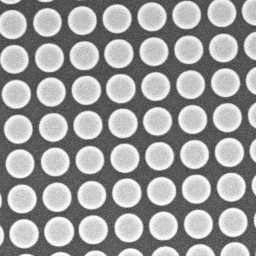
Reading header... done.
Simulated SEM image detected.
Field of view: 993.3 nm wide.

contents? an array of small figures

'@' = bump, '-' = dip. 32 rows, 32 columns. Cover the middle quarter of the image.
---@@@@@----@@@-----------------
--------------------------------
---------------------@@@@----@@@
----@@@@----@@@@@---@@@@@@---@@@
---@@@@@@--@@@@@@@-@@@@@@@--@@@@
--@@@@@@@--@@@@@@@-@@@@@@@--@@@@
--@@@@@@@--@@@@@@@-@@@@@@@--@@@@
--@@@@@@@--@@@@@@@--@@@@@@---@@@
---@@@@@@--@@@@@@----@@@@-----@@
---@@@@@-----@@@----------------
-------------------------------@
-------------@@@-----@@@@@----@@
----@@@@----@@@@@@--@@@@@@---@@@
---@@@@@@--@@@@@@@--@@@@@@@--@@@
@-@@@@@@@--@@@@@@@--@@@@@@@--@@@
@-@@@@@@@--@@@@@@@--@@@@@@@--@@@
@--@@@@@@--@@@@@@@---@@@@@----@@
@--@@@@@@---@@@@@-----@@@-------
----@@@-------------------------
-------------------------------@
-------------@@@@----@@@@@----@@
----@@@@@---@@@@@@---@@@@@@--@@@
@--@@@@@@@--@@@@@@@-@@@@@@@--@@@
@--@@@@@@@--@@@@@@@-@@@@@@@--@@@
@--@@@@@@@--@@@@@@@--@@@@@@---@@
@--@@@@@@@--@@@@@@---@@@@@-----@
@---@@@@@----@@@@------@@-------
--------------------------------
-----------------------@@@-----@
------@@-----@@@@@----@@@@@---@@
@---@@@@@@--@@@@@@@--@@@@@@@--@@
@---@@@@@@--@@@@@@@--@@@@@@@--@@